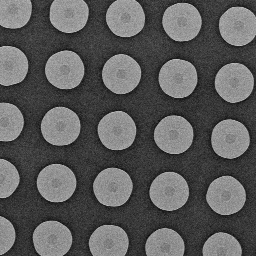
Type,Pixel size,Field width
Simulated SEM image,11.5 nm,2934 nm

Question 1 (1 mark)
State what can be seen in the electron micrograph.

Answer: an array of small figures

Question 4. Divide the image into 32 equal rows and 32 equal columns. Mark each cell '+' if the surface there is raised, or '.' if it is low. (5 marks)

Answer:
++++...++++...+++.....++........
++++..+++++..+++++...++++...+++.
++++..+++++..+++++..+++++..+++++
.+.....+++....++++...++++..+++++
...............+.....+++....++++
.............................++.
+++....++.......................
+++...++++....+++....++.........
+++...++++...+++++..++++....+++.
+++...++++...+++++..+++++..+++++
++.....+++...++++...+++++..+++++
..............++.....+++...++++.
............................++..
++.....+........................
+++...++++...+++.....+..........
+++..+++++..+++++...++++...+++..
+++..+++++..+++++..+++++...++++.
++....+++....++++..+++++..+++++.
..............++....++++...++++.
............................++..
+...............................
++...++++....+++................
++...++++...++++...++++....+++..
++...++++...+++++..+++++..++++..
+....++++...++++...+++++..+++++.
.............++....++++...++++..
...........................+++..
+...............................
++...+++....+++.................
++..+++++..+++++...++++...+++...
++..+++++..+++++..+++++...++++..
+....+++...+++++..+++++..+++++..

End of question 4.